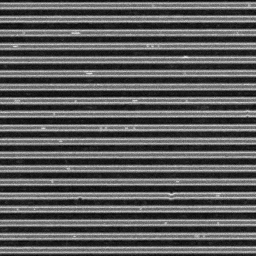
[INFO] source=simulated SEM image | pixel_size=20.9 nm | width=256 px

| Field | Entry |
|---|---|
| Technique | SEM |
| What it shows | parallel lines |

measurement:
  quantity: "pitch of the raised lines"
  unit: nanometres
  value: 283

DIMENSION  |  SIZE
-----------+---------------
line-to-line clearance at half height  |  156 nm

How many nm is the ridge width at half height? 120